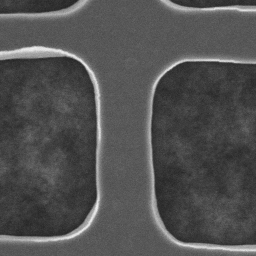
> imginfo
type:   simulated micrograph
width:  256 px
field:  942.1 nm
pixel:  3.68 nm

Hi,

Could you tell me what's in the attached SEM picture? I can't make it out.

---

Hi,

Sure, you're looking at holes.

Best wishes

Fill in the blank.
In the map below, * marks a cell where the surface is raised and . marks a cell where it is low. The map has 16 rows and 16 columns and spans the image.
....************
****************
****************
*...************
.....*****......
......****......
......****......
......***.......
......***.......
......***.......
......****......
......****......
......****......
......****......
.....*****......
****************